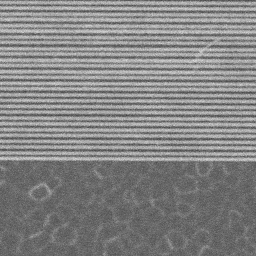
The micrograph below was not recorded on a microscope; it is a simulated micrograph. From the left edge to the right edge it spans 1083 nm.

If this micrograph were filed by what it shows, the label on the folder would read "parallel lines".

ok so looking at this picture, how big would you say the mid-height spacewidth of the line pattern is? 2.39 pixels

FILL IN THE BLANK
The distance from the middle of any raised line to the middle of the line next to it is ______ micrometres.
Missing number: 0.0244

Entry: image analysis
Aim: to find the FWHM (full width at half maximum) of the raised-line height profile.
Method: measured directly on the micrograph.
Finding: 13.2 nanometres